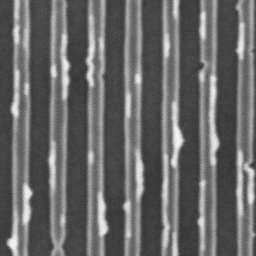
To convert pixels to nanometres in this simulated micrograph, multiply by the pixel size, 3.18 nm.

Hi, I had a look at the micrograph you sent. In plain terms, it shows parallel lines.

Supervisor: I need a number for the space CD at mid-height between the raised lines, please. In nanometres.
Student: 74.7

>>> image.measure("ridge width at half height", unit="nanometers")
45.3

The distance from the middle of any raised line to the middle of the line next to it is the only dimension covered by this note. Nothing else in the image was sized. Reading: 0.119 micrometres